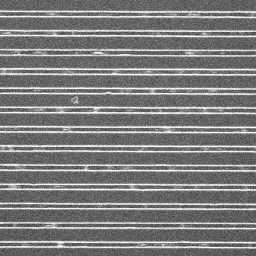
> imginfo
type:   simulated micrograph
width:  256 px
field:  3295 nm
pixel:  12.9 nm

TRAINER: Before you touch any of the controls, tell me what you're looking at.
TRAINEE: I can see parallel lines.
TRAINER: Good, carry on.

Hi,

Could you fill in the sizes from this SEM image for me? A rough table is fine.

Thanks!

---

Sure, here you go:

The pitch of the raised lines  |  0.247 µm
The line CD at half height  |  14.9 px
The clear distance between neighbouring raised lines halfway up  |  4.37 pixels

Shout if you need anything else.